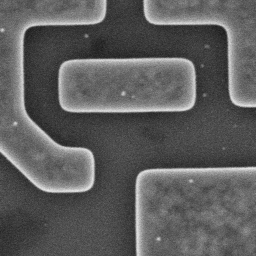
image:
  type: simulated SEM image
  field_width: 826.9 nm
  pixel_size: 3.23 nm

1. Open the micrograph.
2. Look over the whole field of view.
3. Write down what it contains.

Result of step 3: wiring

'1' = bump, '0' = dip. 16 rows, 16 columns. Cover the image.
1111111001111111
1111100000000111
1000000000000011
1000000000000011
1000111111110011
1000111111110011
1100111111110001
1100000000000000
1110000000000000
1111110000000000
0111110000000001
0011110001111111
0000000001111111
0000000001111111
0000000001111111
0000000001111111